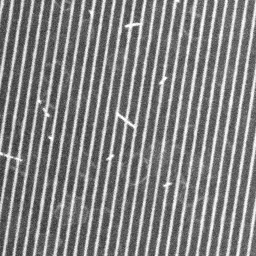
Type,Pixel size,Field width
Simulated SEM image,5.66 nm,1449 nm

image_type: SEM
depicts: parallel lines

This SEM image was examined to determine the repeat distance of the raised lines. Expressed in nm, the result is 56.9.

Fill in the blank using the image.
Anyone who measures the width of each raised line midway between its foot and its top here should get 9.1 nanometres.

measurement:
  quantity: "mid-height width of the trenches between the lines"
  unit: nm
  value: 47.5